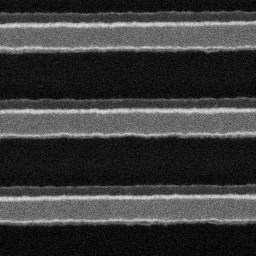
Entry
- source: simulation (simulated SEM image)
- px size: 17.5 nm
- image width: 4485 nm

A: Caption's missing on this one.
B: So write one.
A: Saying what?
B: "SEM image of lines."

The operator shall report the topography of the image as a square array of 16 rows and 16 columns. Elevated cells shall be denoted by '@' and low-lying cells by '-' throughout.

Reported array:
----------------
@@@@@@@@@@@@@@@@
@@@@@@@@@@@@@@@@
----------------
----------------
----------------
@@@@@@@@@@@@@@@@
@@@@@@@@@@@@@@@@
@@@@-------@----
----------------
----------------
----------------
@@@@@@@@@@@@@@@@
@@@@@@@@@@@@@@@@
----------------
----------------